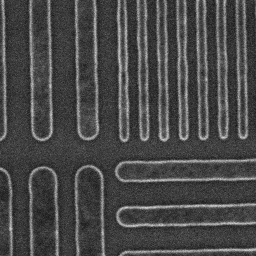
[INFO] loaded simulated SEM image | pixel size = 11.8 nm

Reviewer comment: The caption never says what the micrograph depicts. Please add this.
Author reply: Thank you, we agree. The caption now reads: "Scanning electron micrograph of groups of lines, slits or small figures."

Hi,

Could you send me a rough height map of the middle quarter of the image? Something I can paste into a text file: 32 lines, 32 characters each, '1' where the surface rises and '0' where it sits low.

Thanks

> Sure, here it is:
00011111000000110001100011000110
00011111000000110001100011000110
00001111000000110001100011000110
00011111000000110001100011000110
00011111000000110001100011000110
00011111000000110001100011000110
00001111000000110001100011000110
00001111000000110001100011000110
00001111000000110001100011000110
00001111000000110001100011000110
00001111000000110001100011000110
00001111000000110001100011000110
00001111000000110001100011000110
00001111000000110001100011000110
00001111000000110001100011000110
00001111000000110001100011000110
00001111100000110001100011000110
00001111000000110001100011000110
00000110000000110001100011000110
00000000000000000000000000000000
00000000000000000000000000000000
00000000000000000000000000000000
00000000000000000000000000000000
00000000000000000000000000000000
00000000000000011111001111111111
00000000000001111111111111111111
00001111100001111111111111111111
00011111100001111111111111111111
00011111100000111111111111111111
00011111110000000000000000000000
00011111110000000000000000000000
00011111100000000000000000000000